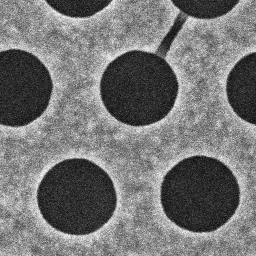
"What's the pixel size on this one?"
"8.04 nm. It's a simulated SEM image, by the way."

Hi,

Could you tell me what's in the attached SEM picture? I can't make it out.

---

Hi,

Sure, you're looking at holes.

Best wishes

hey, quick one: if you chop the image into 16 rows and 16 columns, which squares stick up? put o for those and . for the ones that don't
ooo....oooo....o
ooooooooooo.oooo
oooooooooo.ooooo
..ooooo...ooooo.
...ooo.....ooo..
...ooo.....ooo..
...ooo.....ooo..
..ooooo...ooooo.
oooooooooooooooo
oooooooooooooooo
ooo...ooooo...oo
oo.....ooo.....o
oo.....ooo.....o
ooo....ooo.....o
oooo..oooooo.ooo
oooooooooooooooo